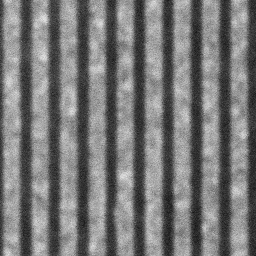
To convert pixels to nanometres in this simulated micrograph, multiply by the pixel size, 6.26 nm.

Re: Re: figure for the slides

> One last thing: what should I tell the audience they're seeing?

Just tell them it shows parallel lines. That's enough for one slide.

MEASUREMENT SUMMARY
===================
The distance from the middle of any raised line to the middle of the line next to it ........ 178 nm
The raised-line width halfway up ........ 90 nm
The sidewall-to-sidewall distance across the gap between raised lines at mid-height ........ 84.5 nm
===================